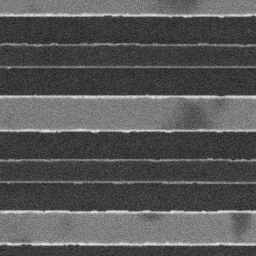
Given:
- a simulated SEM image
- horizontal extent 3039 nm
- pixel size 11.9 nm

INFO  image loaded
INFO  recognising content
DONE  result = lines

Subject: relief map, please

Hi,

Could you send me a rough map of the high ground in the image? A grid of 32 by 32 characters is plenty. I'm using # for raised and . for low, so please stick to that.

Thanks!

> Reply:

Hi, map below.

################################
################################
................................
................................
................................
####..##..#.######.......#......
################################
################################
................................
................................
................................
................................
################################
################################
################################
################################
................................
................................
................................
................................
################################
################################
################################
................................
................................
................................
.#.##.##...................##...
################################
################################
################################
.#...##...##################.###
................................